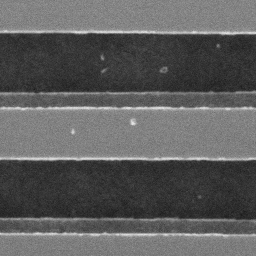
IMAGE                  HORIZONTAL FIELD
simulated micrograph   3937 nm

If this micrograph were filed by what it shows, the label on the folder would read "lines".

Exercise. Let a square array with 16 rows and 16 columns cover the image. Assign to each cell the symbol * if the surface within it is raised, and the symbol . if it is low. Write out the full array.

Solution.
****************
****************
................
................
................
................
****************
****************
****************
****************
................
................
................
................
****************
****************